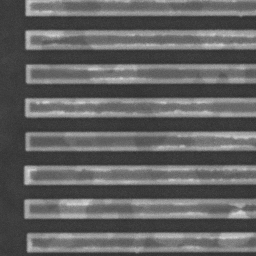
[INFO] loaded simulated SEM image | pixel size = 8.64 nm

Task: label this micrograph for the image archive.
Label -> parallel lines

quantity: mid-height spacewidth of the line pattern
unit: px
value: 18.1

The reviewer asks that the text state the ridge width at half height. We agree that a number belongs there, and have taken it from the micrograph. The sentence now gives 15.5 pixels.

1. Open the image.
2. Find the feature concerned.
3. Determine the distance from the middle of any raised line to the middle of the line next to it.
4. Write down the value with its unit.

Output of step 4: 292 nanometers